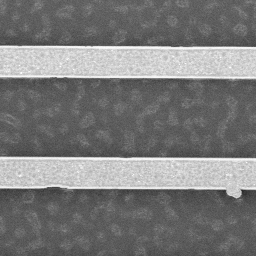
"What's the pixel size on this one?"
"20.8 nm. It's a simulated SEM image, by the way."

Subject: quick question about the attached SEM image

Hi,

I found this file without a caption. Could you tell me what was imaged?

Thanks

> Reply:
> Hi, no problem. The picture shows one or a few lines or trenches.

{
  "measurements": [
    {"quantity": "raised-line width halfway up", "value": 609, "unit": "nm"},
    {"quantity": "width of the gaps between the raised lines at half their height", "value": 1700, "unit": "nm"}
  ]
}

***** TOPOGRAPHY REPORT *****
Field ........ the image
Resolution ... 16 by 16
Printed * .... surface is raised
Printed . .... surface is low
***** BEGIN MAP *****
................
................
................
****************
****************
................
................
................
................
................
****************
****************
................
................
................
................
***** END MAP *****